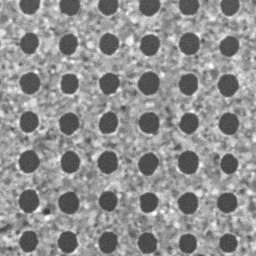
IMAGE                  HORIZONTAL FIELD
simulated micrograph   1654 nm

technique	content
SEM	a regular array of holes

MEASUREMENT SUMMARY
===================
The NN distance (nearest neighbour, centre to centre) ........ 0.252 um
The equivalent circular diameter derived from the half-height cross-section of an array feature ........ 146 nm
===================